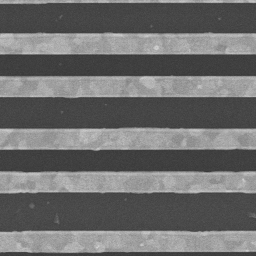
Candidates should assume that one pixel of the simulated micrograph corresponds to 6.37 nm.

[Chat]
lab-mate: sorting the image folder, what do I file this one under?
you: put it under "lines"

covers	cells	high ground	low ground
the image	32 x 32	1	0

00000000000000000000000000000000
00000000000000000000000000000000
00000000000000000000000000000000
00000000000000000000000000000000
11111111111111111111111111111111
11111111111111111111111111111111
11111111111111111111111111111111
00000000000000000000000000000000
00000000000000000000000000000000
00000000000000000000000000000000
11111111111111111111111111111111
11111111111111111111111111111111
00000000000000000000000000000000
00000000000000000000000000000000
00000000000000000000000000000000
00000000000000000000000000000000
11111111111111111111111111111111
11111111111111111111111111111111
11111111111111111111111111111111
00000000000000000000000000000000
00000000000000000000000000000000
11000000000000000001110000000011
11111111111111111111111111111111
11111111111111111111111111111111
00000000000000000000000000000000
00000000000000000000000000000000
00000000000000000000000000000000
00000000000000000000000000000000
00000000000000000000000000000000
11111111111111111111111111111111
11111111111111111111111111111111
00011111111110000000000000000000